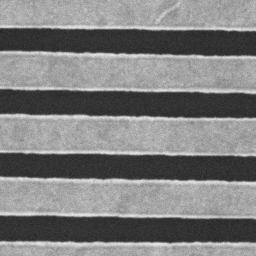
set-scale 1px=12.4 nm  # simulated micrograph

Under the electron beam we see lines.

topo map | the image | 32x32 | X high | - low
XXXXXXXXXXXXXXXXXXXXXXXXXXXXXXXX
XXXXXXXXXXXXXXXXXXXXXXXXXXXXXXXX
XXXXXXXXXXXXXXXXXXXXXXXXXXXXXXXX
-----------XXXXXXXXXXXXXXXXXXXXX
--------------------------------
--------------------------------
--------------------------------
XXXXXXXXXXXXXXXXXXXXXXXXXXXXXXXX
XXXXXXXXXXXXXXXXXXXXXXXXXXXXXXXX
XXXXXXXXXXXXXXXXXXXXXXXXXXXXXXXX
XXXXXXXXXXXXXXXXXXXXXXXXXXXXXXXX
--------------------------------
--------------------------------
--------------------------------
XXXXX---------------------------
XXXXXXXXXXXXXXXXXXXXXXXXXXXXXXXX
XXXXXXXXXXXXXXXXXXXXXXXXXXXXXXXX
XXXXXXXXXXXXXXXXXXXXXXXXXXXXXXXX
XXXXXXXXXXXXXXXXXXXXXXXXXXXXXXXX
--------------------------------
--------------------------------
--------------------------------
XXXXXXXXX-----------------------
XXXXXXXXXXXXXXXXXXXXXXXXXXXXXXXX
XXXXXXXXXXXXXXXXXXXXXXXXXXXXXXXX
XXXXXXXXXXXXXXXXXXXXXXXXXXXXXXXX
XXXXXXXXXXXXXXXXXXXXXXXXXXXXXXXX
--------------------------------
--------------------------------
--------------------------------
XXXXXXXXXX-XXXXXXXX-X-XXXXXXXX--
XXXXXXXXXXXXXXXXXXXXXXXXXXXXXXXX